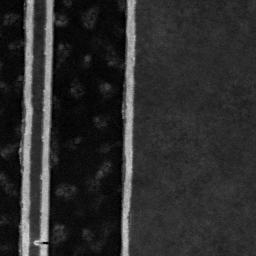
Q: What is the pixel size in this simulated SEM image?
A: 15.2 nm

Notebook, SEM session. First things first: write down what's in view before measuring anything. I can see one or a few lines or trenches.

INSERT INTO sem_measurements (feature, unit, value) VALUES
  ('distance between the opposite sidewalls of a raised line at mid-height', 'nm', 290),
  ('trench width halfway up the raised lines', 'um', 1.26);